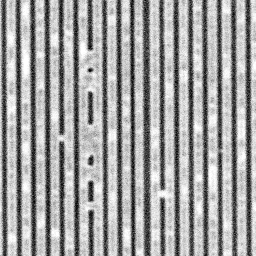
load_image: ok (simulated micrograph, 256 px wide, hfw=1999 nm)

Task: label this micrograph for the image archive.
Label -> parallel lines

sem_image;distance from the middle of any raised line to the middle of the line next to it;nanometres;112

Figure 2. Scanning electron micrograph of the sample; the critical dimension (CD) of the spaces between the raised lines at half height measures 53.7 nanometers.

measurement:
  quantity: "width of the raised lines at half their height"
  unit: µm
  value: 0.0595